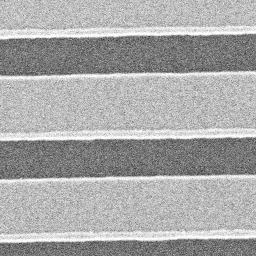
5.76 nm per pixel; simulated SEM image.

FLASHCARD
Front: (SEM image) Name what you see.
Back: lines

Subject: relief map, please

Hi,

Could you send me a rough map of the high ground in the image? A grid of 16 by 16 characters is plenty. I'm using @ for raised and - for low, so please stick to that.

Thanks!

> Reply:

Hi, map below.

@@@@@@@@@@@@@@@@
@@@@@@@@@@@@@@@@
----------------
----------------
---------------@
@@@@@@@@@@@@@@@@
@@@@@@@@@@@@@@@@
@@@@@@@@@@@@@@@@
@@@@@@@@@@@@@@@@
----------------
----------------
@@@@@@@@@@@@@@@@
@@@@@@@@@@@@@@@@
@@@@@@@@@@@@@@@@
@@@@@@@@@@@@@@@@
----------------